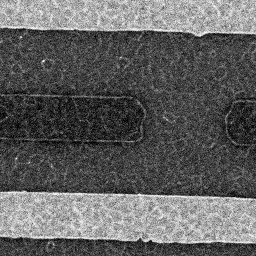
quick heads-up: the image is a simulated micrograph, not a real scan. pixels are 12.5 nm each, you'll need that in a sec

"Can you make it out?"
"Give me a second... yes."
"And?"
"one or a few lines or trenches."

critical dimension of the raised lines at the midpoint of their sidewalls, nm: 550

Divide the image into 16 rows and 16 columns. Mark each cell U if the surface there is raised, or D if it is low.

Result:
UUUUUUUUUUUUUUUU
UUUUUUUUUUUUUUUU
DDDDDDDDDDDDDDDD
DDDDDDDDDDDDDDDD
DDDDDDDDDDDDDDDD
DDDDDDDDDDDDDDDD
UUUUUUUUUDDDDDDU
UUUUUUUUUDDDDDUU
UUUUUUUUUDDDDDUU
DDDDDDDDDDDDDDDD
DDDDDDDDDDDDDDDD
DDDDDDDDDDDDDDDD
UUUUUUUUUUUUUUUU
UUUUUUUUUUUUUUUU
UUUUUUUUUUUUUUUU
DDDDDDDDDDDDDDDD